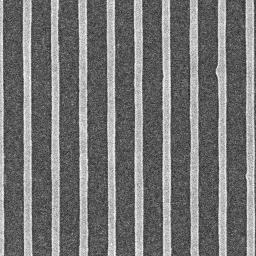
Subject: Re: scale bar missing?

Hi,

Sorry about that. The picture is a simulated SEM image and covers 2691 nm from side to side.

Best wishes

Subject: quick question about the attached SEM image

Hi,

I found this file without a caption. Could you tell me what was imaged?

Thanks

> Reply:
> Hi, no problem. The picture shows parallel lines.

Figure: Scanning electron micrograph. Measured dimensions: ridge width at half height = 78.8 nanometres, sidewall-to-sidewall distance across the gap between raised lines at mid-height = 218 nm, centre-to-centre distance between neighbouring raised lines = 27.8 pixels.